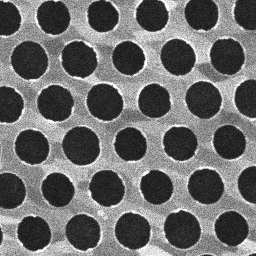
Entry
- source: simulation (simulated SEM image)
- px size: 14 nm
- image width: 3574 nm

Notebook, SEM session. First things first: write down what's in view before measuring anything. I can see a regular array of holes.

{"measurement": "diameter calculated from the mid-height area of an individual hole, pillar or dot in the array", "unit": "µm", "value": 0.508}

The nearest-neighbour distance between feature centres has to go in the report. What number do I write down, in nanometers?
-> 687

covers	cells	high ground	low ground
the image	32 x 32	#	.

..###...###...###....##....##...
..###....##....##....##....##...
...##....##....##....##....##...
..###...####..####..####...###..
.###############################
##...####..####..####...###...##
##....##....##....##....##.....#
#.....##....##....##....##.....#
##....##....##....###...###...##
##...####..###########.#########
############..#####.####...###..
..###....##....###...##....##...
...##....##....##....##.....#...
...##....##....##....###....##..
...##....###...###..#####..####.
################################
###..###....###...###...###...##
##....##....##....##.....##....#
##....##....##....##.....##....#
##....##....###...###...###...##
####.####..#####################
############..#####.####...###..
...###...##....###...###....##..
...##....##.....##....##....##..
...##....##....###...###....##..
...###...###...####.############
######################..####..##
###...###...###...###....##....#
##....##....##.....#.....##....#
##....##.....#.....##....##....#
###...###...###...###...####..##
################################